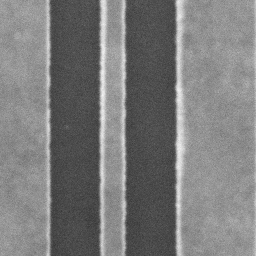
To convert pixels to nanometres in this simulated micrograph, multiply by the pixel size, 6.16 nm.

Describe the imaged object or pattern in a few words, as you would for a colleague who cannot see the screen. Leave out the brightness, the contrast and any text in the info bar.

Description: lines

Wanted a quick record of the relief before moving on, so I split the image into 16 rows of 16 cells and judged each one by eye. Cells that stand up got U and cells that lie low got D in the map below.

UUUDDDUUDDDUUUUU
UUUDDDUUDDDUUUUU
UUUDDDUUDDDUUUUU
UUUDDDUUDDDUUUUU
UUUDDDUUDDDUUUUU
UUUDDDUUDDDUUUUU
UUUDDDUUDDDUUUUU
UUUDDDUUDDDUUUUU
UUUDDDUUDDDUUUUU
UUUDDDUUDDDUUUUU
UUUDDDUUDDDUUUUU
UUUDDDUUDDDUUUUU
UUUDDDUUDDDUUUUU
UUUDDDUUDDDUUUUU
UUUDDDUUDDDUUUUU
UUUDDDUUDDDUUUUU